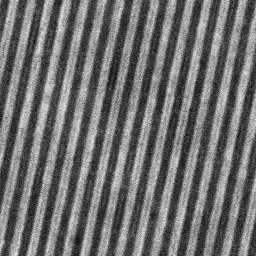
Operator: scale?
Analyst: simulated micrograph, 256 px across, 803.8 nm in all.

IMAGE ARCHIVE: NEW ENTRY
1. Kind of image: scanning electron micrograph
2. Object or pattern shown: parallel lines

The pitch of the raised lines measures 0.0541 microns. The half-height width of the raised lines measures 25.4 nm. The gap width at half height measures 0.028 micrometres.